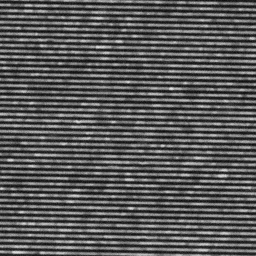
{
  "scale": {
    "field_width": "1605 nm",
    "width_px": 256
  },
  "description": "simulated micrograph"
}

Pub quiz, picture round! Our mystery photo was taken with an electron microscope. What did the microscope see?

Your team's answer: parallel lines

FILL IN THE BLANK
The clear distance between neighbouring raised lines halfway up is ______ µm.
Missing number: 0.0243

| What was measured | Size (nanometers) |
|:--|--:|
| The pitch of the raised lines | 36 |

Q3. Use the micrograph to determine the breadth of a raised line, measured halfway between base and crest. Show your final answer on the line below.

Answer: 11.8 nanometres